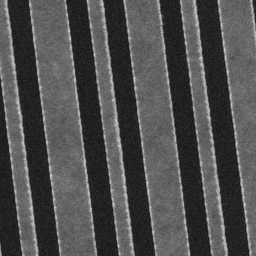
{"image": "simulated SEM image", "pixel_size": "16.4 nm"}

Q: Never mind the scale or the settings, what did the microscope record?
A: lines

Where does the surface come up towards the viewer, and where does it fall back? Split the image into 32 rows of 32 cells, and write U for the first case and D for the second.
UDDDUUUUDDDUUDDUUUUUDDDUDDDUUUUU
UDDDUUUUDDDUUDDDUUUUDDDUUDDUUUUU
UDDDUUUUUDDUUDDDUUUUDDDUUDDDUUUU
UDDDUUUUUDDUUDDDUUUUDDDUUDDDUUUU
UDDDUUUUUDDUUDDDUUUUDDDUUDDDUUUU
UDDDUUUUUDDDUUDDUUUUUDDUUDDDUUUU
UUDDUUUUUDDDUUDDUUUUUDDUUDDDUUUU
UUDDDUUUUDDDUUDDUUUUUDDUUDDDUUUU
UUDDDUUUUDDDUUDDUUUUUDDDUDDDUUUU
UUDDDUUUUDDDUUDDDUUUUDDDUUDDUUUU
UUDDDUUUUUDDUUDDDUUUUDDDUUDDDUUU
UUDDDUUUUUDDUUDDDUUUUDDDUUDDDUUU
UUDDDUUUUUDDUUDDDUUUUDDDUUDDDUUU
DUDDDUUUUUDDDUUDDUUUUUDDUUDDDUUU
DUUDDUUUUUDDDUUDDUUUUUDDUUDDDUUU
DUUDDUUUUUDDDUUDDUUUUUDDUUDDDUUU
DUUDDDUUUUDDDUUDDUUUUUDDDUUDDUUU
DUUDDDUUUUDDDUUDDDUUUUDDDUUDDDUU
DUUDDDUUUUUDDUUDDDUUUUDDDUUDDDUU
DUUDDDUUUUUDDUUDDDUUUUDDDUUDDDUU
DUUDDDUUUUUDDUUDDDUUUUDDDUUDDDUU
DUUDDDUUUUUDDDUDDDUUUUDDDUUDDDUU
DDUUDDUUUUUDDDUUDDUUUUUDDUUDDDUU
DDUUDDUUUUUDDDUUDDUUUUUDDUUDDDUU
DDUUDDDUUUUDDDUUDDUUUUUDDDUUDDUU
DDUUDDDUUUUDDDUUDDDUUUUDDDUUDDUU
DDUUDDDUUUUDDDUUDDDUUUUDDDUUDDDU
DDUUDDDUUUUUDDUUDDDUUUUDDDUUDDDU
DDUUDDDUUUUUDDDUDDDUUUUDDDUUDDDU
DDUUDDDUUUUUDDDUDDDUUUUDDDUUDDDU
DDDUUDDUUUUUDDDUUDDUUUUUDDUUDDDU
DDDUUDDUUUUUDDDUUDDUUUUUDDUUDDDU